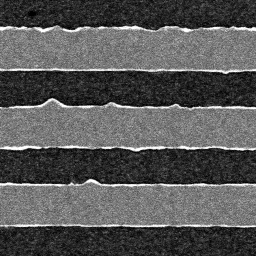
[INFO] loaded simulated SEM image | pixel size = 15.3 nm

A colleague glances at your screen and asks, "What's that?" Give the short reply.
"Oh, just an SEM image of one or a few lines or trenches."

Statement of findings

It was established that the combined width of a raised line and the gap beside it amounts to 1.19 micrometres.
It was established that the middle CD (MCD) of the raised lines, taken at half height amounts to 0.635 µm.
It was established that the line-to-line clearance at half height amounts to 552 nm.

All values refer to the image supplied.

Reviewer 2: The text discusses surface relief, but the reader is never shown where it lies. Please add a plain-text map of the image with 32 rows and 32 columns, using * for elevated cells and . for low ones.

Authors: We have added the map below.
................................
................................
................................
.*..*.**..*******...**...******.
********************************
********************************
********************************
********************************
********************************
................................
................................
................................
......*.........................
***********************.**.*.**.
********************************
********************************
********************************
********************************
***........**..*****...***..****
................................
................................
................................
................................
********************************
********************************
********************************
********************************
********************************
................................
................................
................................
................................